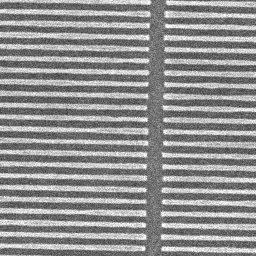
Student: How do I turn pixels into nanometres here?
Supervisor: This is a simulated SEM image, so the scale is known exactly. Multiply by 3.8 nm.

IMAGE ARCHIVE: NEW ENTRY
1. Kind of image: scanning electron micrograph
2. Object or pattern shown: parallel lines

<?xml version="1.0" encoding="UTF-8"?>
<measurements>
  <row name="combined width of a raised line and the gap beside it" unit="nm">44.6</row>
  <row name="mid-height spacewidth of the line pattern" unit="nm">29.5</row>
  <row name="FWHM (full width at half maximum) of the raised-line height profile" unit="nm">14.7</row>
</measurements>